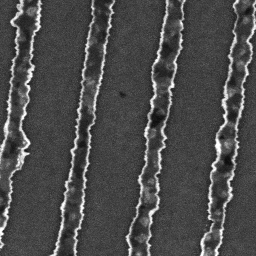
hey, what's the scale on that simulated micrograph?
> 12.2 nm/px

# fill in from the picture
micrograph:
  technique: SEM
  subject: one or a few lines or trenches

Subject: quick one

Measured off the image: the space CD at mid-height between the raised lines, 651 nm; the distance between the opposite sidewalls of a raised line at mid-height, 217 nanometers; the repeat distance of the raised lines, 875 nanometers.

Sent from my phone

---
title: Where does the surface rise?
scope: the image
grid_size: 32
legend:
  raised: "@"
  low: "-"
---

--@@@------@@@-------@@------@@@
--@@@-------@@-------@@------@@@
--@@@-------@@-------@@-------@@
--@@@------@@@------@@@------@@@
--@@-------@@-------@@@------@@-
--@@-------@@-------@@@------@@-
--@@-------@@-------@@-------@@-
--@@-------@@-------@@-------@@-
--@@------@@@------@@@-------@@-
-@@@------@@@------@@@-------@@-
-@@-------@@-------@@@------@@--
-@@@------@@-------@@-------@@--
-@@@------@@-------@@-------@@--
-@@-------@@-------@@-------@@--
-@@-------@@-------@@-------@@--
-@@-------@@-------@@-------@@--
-@@-------@-------@@-------@@@--
-@@------@@-------@@@------@@@--
@@@------@@-------@@-------@@@--
@@@------@@-------@@-------@@---
@@@------@@-------@@-------@@---
@@-------@@-------@@------@@@---
@--------@@------@@@------@@@---
@-------@@@-------@@------@@@---
@-------@@@-------@@------@@@---
@-------@@-------@@@------@@----
@-------@@-------@@-------@@----
@-------@@-------@@-------@@----
@-------@@------@@@-------@@----
-------@@@------@@@-------@@----
-------@@@------@@@------@@-----
-------@@-------@@@------@@-----